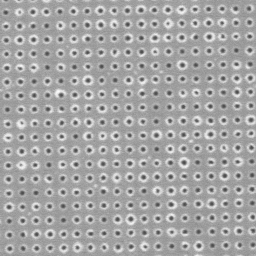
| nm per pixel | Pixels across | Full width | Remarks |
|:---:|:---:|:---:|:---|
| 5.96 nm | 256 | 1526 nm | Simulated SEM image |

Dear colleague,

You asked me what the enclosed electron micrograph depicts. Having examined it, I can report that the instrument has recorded a regular array of holes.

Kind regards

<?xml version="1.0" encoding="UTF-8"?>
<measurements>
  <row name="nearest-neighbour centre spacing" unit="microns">0.0797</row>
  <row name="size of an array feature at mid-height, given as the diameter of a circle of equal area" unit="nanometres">30.1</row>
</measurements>